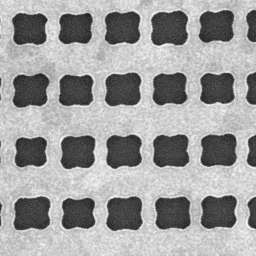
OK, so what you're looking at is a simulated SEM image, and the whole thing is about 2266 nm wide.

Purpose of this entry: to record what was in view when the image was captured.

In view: a regular array of holes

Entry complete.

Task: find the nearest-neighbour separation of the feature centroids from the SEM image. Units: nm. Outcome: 409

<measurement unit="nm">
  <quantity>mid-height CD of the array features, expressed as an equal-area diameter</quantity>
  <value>330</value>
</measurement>